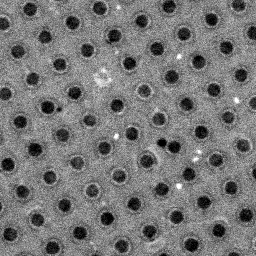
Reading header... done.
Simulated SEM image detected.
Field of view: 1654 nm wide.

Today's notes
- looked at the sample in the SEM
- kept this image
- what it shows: a regular array of raised bodies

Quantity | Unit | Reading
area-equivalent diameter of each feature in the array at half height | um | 0.103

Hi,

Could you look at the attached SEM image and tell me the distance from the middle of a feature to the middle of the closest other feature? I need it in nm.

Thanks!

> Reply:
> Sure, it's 199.